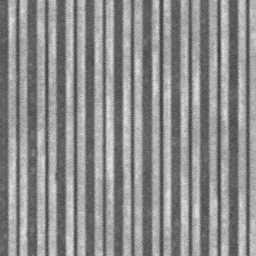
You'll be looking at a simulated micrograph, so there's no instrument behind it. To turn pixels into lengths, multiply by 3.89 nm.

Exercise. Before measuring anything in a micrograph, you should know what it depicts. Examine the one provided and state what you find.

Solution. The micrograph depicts parallel lines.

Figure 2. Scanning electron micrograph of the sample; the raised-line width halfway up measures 26.8 nm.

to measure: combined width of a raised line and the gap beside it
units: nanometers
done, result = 56